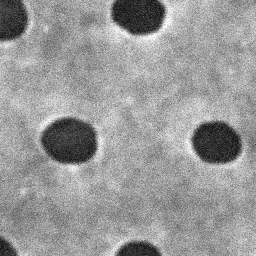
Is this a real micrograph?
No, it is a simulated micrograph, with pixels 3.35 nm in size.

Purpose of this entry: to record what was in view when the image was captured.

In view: holes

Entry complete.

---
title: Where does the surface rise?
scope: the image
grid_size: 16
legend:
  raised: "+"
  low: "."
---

..+++++...++++++
..+++++...++++++
.+++++++++++++++
++++++++++++++++
++++++++++++++++
++++++++++++++++
++++++++++++++++
+++..+++++++++++
++....++++++...+
+++...++++++...+
++++++++++++++++
++++++++++++++++
++++++++++++++++
++++++++++++++++
++++++++++++++++
.++++++...++++++